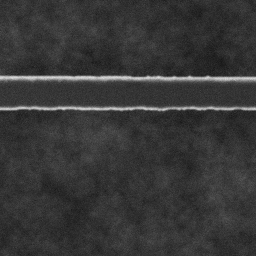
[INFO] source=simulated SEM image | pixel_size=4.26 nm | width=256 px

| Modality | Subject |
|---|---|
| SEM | lines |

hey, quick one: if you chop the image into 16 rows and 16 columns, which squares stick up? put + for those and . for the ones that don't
................
................
................
................
................
++++++++++++++++
++++++++++++++++
................
................
................
................
................
................
................
................
................